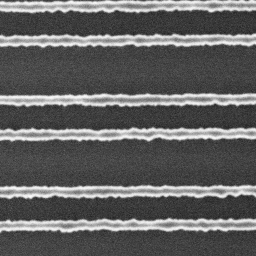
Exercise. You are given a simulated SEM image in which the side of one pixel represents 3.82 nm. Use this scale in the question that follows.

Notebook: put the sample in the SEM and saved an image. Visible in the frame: lines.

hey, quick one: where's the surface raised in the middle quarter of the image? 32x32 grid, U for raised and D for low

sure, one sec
DDDDDDDDDDDDDDDDDDDDDDDDDDDDDDDD
DDDDDDDDDDDDDDDDDDDDDDDDDDDDDDDD
DDDDDDDDDDDDDDDDDDDDDDDDDDDDDDDD
DDDDDDDDDDDDDDDDDDDDDDDDDDDDDDDD
DDDDDDDDDDDDDDDDDDDDDDDDDDDDDDDD
DDDDDDDDDDDDDDDDDDDDDDDDDDDDDDDD
DDDDDDDDDDDDDDDDDDDDDDDDDDDDDDDD
DDDDDDDDDDDDDDDDDDDDDDDDDDDDDDDD
UUUUUUUUUUUUUUUUUUUUUUUUUUUUUUUU
UUUUUUUUUUUUUUUUUUUUUUUUUUUUUUUU
DDDDDDDDDDDDDDDDDDDDDDDDDDDDDDDD
DDDDDDDDDDDDDDDDDDDDDDDDDDDDDDDD
DDDDDDDDDDDDDDDDDDDDDDDDDDDDDDDD
DDDDDDDDDDDDDDDDDDDDDDDDDDDDDDDD
DDDDDDDDDDDDDDDDDDDDDDDDDDDDDDDD
DDDDDDDDDDDDDDDDDDDDDDDDDDDDDDDD
UUUDUUUDDDDDDUDDUUUUUUUUUUDUUUUU
UUUUUUUUUUUUUUUUUUUUUUUUUUUUUUUU
UUUUUUUUUUUUUUUDDDUUUUUDDUUDUUUD
DDDDDDDDDDDDDDDDDDDDDDDDDDDDDDDD
DDDDDDDDDDDDDDDDDDDDDDDDDDDDDDDD
DDDDDDDDDDDDDDDDDDDDDDDDDDDDDDDD
DDDDDDDDDDDDDDDDDDDDDDDDDDDDDDDD
DDDDDDDDDDDDDDDDDDDDDDDDDDDDDDDD
DDDDDDDDDDDDDDDDDDDDDDDDDDDDDDDD
DDDDDDDDDDDDDDDDDDDDDDDDDDDDDDDD
DDDDDDDDDDDDDDDDDDDDDDDDDDDDDDDD
DDDDDDDDDDDDDDDDDDDDDDDDDDDDDDDD
DDDDDDDDDDDDDDDDDDDDDDDDDDDDDDDD
DDDDDDDDDDDDDDDDDDDDDDDDDDDDDDDD
DDDDDDDDDDDDDDDDDDDDDDDDDDDDDDDD
UUUUUUUUUUUUUUUUUUUUUUUUUUUUUUUU